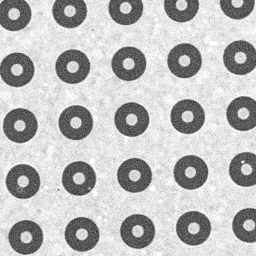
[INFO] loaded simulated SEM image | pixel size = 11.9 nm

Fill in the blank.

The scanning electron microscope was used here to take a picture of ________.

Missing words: an array of small figures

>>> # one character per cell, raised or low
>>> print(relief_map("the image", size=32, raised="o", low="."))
....ooo....ooo....oo.....oo.....
....oo.....ooo....ooo....ooo...o
....ooo....ooo...ooooo..oooooooo
...ooooo.ooooooooooooooooooooooo
oooooooooooooooooooooooooooooooo
oooooooooooooooooooooo..ooooo..o
oooooooo..ooooo...ooo....ooo....
....ooo....ooo....ooo....ooo....
....ooo....ooo....ooo....ooo....
....ooo....oooo...oooo..oooooooo
o..ooooooooooooooooooooooooooooo
oooooooooooooooooooooooooooooooo
ooooooooooooooooooooooo.ooooo...
oo.ooooo...oooo...oooo...ooo....
o...ooo....ooo.....oo.....oo....
.....oo.....oo.....oo.....ooo...
.....ooo...oooo...oooo...ooooooo
o...ooooo.oooooooooooooooooooooo
oooooooooooooooooooooooooooooooo
ooooooooooooooooooooooo..oooo...
oo.oooooo..oooo...oooo....ooo...
o....ooo....ooo....ooo....ooo...
o....ooo....ooo....ooo....ooo...
o....ooo....ooo...ooooo..ooooooo
oo..oooooooooooooooooooooooooooo
oooooooooooooooooooooooooooooooo
ooooooooooooooooooooooo..ooooo..
ooo.ooooo..oooo....ooo....ooo...
o....ooo....ooo....ooo....ooo...
o....ooo....ooo....ooo....ooo...
o....ooo....oooo...oooo..ooooooo
oo..oooooooooooooooooooooooooooo